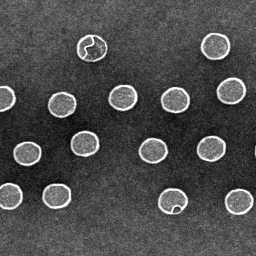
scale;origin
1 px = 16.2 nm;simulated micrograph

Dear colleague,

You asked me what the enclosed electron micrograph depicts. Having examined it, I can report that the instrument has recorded a regular array of raised bodies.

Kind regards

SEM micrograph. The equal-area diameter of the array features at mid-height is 0.424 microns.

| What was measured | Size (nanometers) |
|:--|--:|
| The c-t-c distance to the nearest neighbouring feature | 841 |